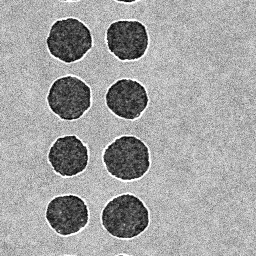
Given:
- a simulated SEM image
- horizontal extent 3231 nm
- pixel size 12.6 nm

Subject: a regular array of holes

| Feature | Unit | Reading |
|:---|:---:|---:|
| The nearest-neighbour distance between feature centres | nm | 730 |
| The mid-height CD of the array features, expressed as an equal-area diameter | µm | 0.531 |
